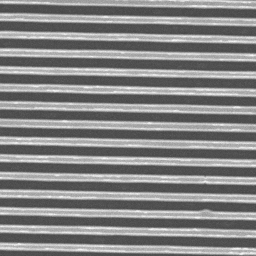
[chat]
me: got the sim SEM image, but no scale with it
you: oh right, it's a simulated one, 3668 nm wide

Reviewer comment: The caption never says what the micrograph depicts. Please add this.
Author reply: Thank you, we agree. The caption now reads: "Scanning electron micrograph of parallel lines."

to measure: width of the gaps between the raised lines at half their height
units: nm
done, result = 158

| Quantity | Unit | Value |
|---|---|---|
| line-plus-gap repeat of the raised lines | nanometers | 253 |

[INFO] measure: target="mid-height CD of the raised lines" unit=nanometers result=96.7